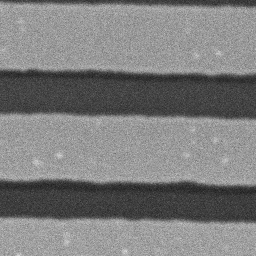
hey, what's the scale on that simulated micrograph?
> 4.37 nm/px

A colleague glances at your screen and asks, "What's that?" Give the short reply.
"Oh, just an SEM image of lines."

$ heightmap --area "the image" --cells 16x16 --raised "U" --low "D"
UUUUUUUUUUUUUUUU
UUUUUUUUUUUUUUUU
UUUUUUUUUUUUUUUU
UUUUUUUUUUUUUUUU
DDDDDDDDDUUUUUUU
DDDDDDDDDDDDDDDD
DDDDDDDDDDDDDDDD
UUUUUUUUUUUUUUUU
UUUUUUUUUUUUUUUU
UUUUUUUUUUUUUUUU
UUUUUUUUUUUUUUUU
DDDDDDDDDDDDDUUU
DDDDDDDDDDDDDDDD
DDDDDDDDDDDDDDDD
UUUUUUUUUUUUUUUU
UUUUUUUUUUUUUUUU